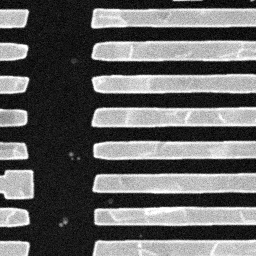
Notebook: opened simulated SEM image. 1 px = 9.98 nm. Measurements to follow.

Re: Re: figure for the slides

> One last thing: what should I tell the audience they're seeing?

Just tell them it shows wiring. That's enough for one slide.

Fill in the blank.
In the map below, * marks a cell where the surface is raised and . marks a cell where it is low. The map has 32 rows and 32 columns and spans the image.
................................
***.........********************
***.........********************
................................
................................
**..........********************
***.........********************
.............********....****...
................................
.............***.***************
***.........********************
***..........********.......****
................................
................................
***.........********************
***.........********************
................................
................................
***.........********************
***.........********************
................................
.***............................
****........********************
****........********************
.***............................
................................
***.........********************
****........********************
................................
................................
***.........********************
***.........********************